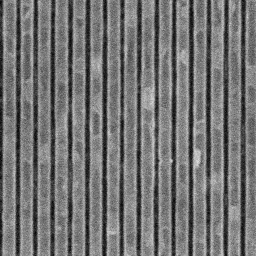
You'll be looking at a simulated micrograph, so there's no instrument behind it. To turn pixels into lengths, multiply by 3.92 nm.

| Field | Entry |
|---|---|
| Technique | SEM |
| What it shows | parallel lines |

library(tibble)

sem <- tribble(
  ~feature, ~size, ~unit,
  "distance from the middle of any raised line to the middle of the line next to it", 68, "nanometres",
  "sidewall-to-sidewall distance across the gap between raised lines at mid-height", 22.1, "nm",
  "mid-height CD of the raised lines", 0.0446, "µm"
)